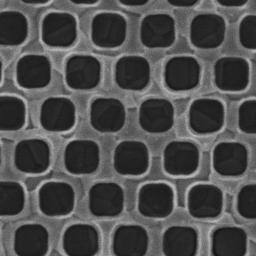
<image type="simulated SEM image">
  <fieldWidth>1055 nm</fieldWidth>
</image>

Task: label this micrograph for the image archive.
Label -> a regular array of holes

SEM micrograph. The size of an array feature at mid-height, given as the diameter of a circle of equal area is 149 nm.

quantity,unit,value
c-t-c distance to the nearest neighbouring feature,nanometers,202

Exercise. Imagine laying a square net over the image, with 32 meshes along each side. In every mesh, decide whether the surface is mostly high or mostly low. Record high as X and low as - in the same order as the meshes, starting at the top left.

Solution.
XXXXXXXXXXXXXXX---XXX---XXXX---X
--XXXXXXXXXXXXXXXXXXXXXXXXXXXXXX
---XX----XXX----XX----XX----XX--
---XX-----X-----XX----XX----XX--
---XX----XX-----XX----XX----XX--
--XXXX---XXX---XXX---XXX----XX--
XXXXXXXXXXXXXXXXXXXXXXXXXXXXXXXX
XX----XXX---XXX---XXX---XXX----X
XX----XX-----XX----XX----XX----X
XX----XX----XX-----XX----XX----X
XX----XXX---XXX---XXX----XX----X
XXXXXXXXXXXXXXXXXXXXXXXXXXXXXXXX
---XXX---XXX---XXX---XXXX--XXXXX
---XX----XX-----X-----XX----XX--
---XX----XX-----X-----XX----XX--
---XX----XX-----X-----XX----XX--
XXXXXXXXXXXXX-XXXXX-XXXXX--XXX--
XXX--XXXXX-XXXXXXXXXXXXXXXXXXXXX
XX----XX----XXX---XXX----XX----X
XX----XX----XX----XX-----XX----X
XX----XX----XX----XXX----XX----X
XXX--XXXX---XXX---XXX---XXX---XX
XXXXXXXXXXXXXXXXXXXXXXXXXXXXXXXX
---XX----XX----XXX---XXX---XXX--
---XX----XX----XX-----XX----XX--
---XX----XX----XX-----X-----XX--
---XX----XX----XXX---XXX----XX--
XXXXXXXXXXXXXXXXXXXXXXXXXXXXXXXX
XX----XXX---XXX---XXX---XXXX--XX
XX----XX----XX----XX-----XX----X
XX----XX----XX----XX-----XX----X
XX----XX----XX----XX----XXX----X